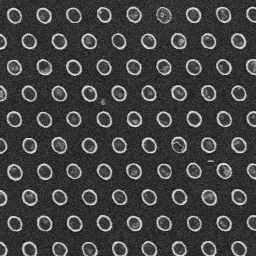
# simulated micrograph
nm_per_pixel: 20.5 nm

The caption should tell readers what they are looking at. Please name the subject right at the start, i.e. a regular array of raised bodies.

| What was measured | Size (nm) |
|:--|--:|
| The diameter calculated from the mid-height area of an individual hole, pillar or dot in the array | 289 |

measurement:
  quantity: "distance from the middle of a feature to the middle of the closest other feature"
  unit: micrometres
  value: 0.608